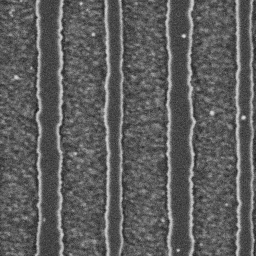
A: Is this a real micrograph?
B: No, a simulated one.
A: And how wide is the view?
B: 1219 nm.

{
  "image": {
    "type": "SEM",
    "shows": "lines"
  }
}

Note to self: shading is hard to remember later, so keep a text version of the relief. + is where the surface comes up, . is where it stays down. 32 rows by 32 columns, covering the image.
.....+++.....++......+++......++
.....+++.....++......+++......++
.....+++.....++......+++......+.
.....+++.....++......+++......+.
.....+++.....++......+++......+.
.....+++.....++......+++......++
.....+++.....++......+++......++
.....+++.....++......+++......++
.....+++......+......+++......++
.....+++.....++......+++......++
.....+++.....++......+++......++
.....+++.....++......+++......++
.....+++.....++......+++......++
.....+++.....++......+++......++
.....+++.....++......+++......++
.....+++.....++......+++......++
.....++......++......+++......++
.....++......++......+++......++
.....+++.....++......+++......++
.....+++......+......+++......++
.....+++.....++......+++......++
.....+++.....++......+++......++
.....+++.....++......+++......++
.....+++.....++......+++......++
.....+++.....++......+++......++
.....+++.....++......+++......++
.....+++.....++......+++......++
.....+++.....++......+++......++
.....+++.....++......+++......++
.....+++.....++......+++......++
.....+++.....++......+++......++
.....+++.....++......+++......++